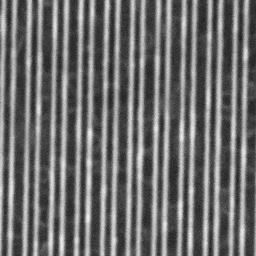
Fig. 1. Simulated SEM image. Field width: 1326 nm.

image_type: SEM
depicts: parallel lines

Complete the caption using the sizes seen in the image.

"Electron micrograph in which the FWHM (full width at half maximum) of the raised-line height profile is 18.1 nm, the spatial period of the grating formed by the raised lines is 66.5 nm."